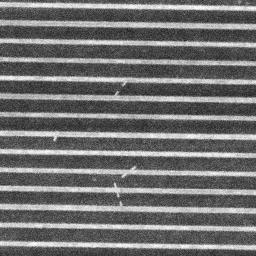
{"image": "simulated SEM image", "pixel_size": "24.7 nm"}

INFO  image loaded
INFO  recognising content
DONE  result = parallel lines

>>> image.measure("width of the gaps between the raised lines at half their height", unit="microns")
0.345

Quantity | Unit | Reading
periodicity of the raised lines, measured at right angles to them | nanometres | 454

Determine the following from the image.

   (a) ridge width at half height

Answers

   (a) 95.6 nm